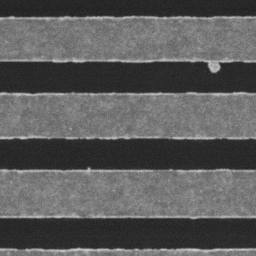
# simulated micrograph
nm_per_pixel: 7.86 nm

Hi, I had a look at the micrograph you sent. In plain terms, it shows lines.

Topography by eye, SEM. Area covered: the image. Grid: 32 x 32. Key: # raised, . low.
................................
................................
################################
################################
################################
################################
################################
################################
................................
................................
................................
................................
################################
################################
################################
################################
################################
................................
................................
................................
................................
################################
################################
################################
################################
################################
################################
................................
................................
................................
................................
################################